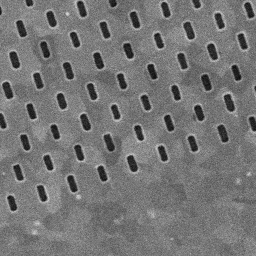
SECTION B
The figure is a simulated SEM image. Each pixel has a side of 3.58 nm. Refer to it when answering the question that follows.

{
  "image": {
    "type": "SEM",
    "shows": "a regular array of holes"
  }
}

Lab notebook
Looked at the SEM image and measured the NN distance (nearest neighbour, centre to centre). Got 31.1 px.